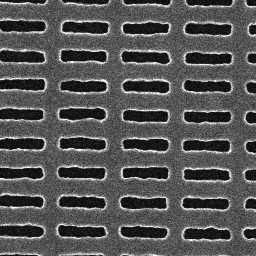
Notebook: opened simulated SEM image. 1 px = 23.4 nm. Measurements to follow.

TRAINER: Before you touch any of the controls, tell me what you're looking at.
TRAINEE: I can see a regular array of holes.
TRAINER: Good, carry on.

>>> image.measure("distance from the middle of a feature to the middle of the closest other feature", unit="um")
0.677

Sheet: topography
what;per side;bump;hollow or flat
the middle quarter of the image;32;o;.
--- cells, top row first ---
oooooooooooooooooooooooooooooooo
oooooooooooooooooooooooooooooooo
oooooooooooooooooooooooooooooooo
oooooooooooooooooooooooooooooooo
..........ooooo...........oooo..
...........ooo............oooo..
..........ooooo...........ooooo.
oooooooooooooooooooooooo.ooooooo
oooooooooooooooooooooooooooooooo
oooooooooooooooooooooooooooooooo
oooooooooooooooooooooooooooooooo
..........oooooo.ooooooooooooooo
..........ooooo...........oooo..
......o...ooooo...........oooo..
oooooooooooooooooo.......oooooo.
oooooooooooooooooooooooooooooooo
oooooooooooooooooooooooooooooooo
oooooooooooooooooooooooooooooooo
......oooooooooooooooooooooooooo
..........ooooo...........oooo..
...........oooo...........oooo..
ooooooooooooooooooo..o....oooo..
oooooooooooooooooooooooooooooooo
oooooooooooooooooooooooooooooooo
oooooooooooooooooooooooooooooooo
oooooooooooooooooooooooooooooooo
..........ooooo...........oooo..
..........ooooo...........oooo..
oo.o......ooooo.ooo.......oooo..
oooooooooooooooooooooooooooooooo
oooooooooooooooooooooooooooooooo
oooooooooooooooooooooooooooooooo